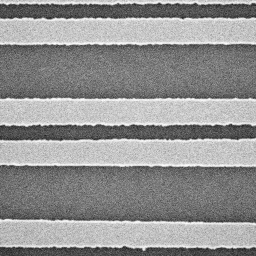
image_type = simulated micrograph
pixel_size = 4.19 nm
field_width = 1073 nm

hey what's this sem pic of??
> lines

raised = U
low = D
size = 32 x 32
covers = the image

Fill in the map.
DDDDDDDUDDDDUUDDDDDDDDDDDUDDDDDD
DDDDDDDDDDDDDDDDDDDDDDDDDDDDDDDD
UUUUUUUUUUUUUUUUUUUUUUUUUUUUUUUU
UUUUUUUUUUUUUUUUUUUUUUUUUUUUUUUU
UUUUUUUUUUUUUUUUUUUUUUUUUUUUUUUU
UUUUUUUUUUUUUUUUUUUUDDUDDDDDUDDU
DDDDDDDDDDDDDDDDDDDDDDDDDDDDDDDD
DDDDDDDDDDDDDDDDDDDDDDDDDDDDDDDD
DDDDDDDDDDDDDDDDDDDDDDDDDDDDDDDD
DDDDDDDDDDDDDDDDDDDDDDDDDDDDDDDD
DDDDDDDDDDDDDDDDDDDDDDDDDDDDDDDD
DDDDDDDDDDDDDDDDDDDDDDDDDDDDDDDD
UUUUUUUUUUUUUUUUUUUUUUUUUUUUUUUU
UUUUUUUUUUUUUUUUUUUUUUUUUUUUUUUU
UUUUUUUUUUUUUUUUUUUUUUUUUUUUUUUU
UUUUUUUUUUUUUUUUUUUUUUUUUUUUUUUU
DDDDDDDDDDDDDDDDDDDDDDDDDDDDDDDD
DDDDDDDDDDDDDDUUUDDDDDDDUUUUUDUU
UUUUUUUUUUUUUUUUUUUUUUUUUUUUUUUU
UUUUUUUUUUUUUUUUUUUUUUUUUUUUUUUU
UUUUUUUUUUUUUUUUUUUUUUUUUUUUUUUU
DDDDDDDDDDDDDDDDDDDDDDDDDDDDDDDD
DDDDDDDDDDDDDDDDDDDDDDDDDDDDDDDD
DDDDDDDDDDDDDDDDDDDDDDDDDDDDDDDD
DDDDDDDDDDDDDDDDDDDDDDDDDDDDDDDD
DDDDDDDDDDDDDDDDDDDDDDDDDDDDDDDD
DDDDDDDDDDDDDDDDDDDDDDDDDDDDDDDD
UUDDDUDDDDDDDDDDDDDDDDDDDDDDDDDD
UUUUUUUUUUUUUUUUUUUUUUUUUUUUUUUU
UUUUUUUUUUUUUUUUUUUUUUUUUUUUUUUU
UUUUUUUUUUUUUUUUUUUUUUUUUUUUUUUU
DDDDDDDDDDDDDDDDDDDDDDDDDDDDDDDD